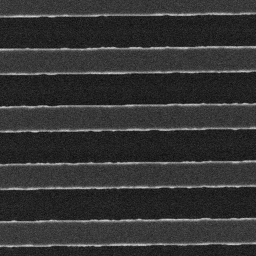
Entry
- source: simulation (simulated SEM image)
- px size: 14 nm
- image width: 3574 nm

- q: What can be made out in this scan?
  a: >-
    lines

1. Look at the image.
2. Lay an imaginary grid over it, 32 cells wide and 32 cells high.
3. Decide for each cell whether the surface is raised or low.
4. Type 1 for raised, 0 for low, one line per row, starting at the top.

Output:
11111111111111111111111111111111
11111111111111111111111111111111
00000000000000000000000000000000
00000000000000000000000000000000
00000000000000000000000000000000
00000000000000000000000000000000
11111111111111111111111111111111
11111111111111111111111111111111
11111111111111111111111111111111
00000000000000000000000000000000
00000000000000000000000000000000
00000000000000000000000000000000
00000000000000000000000000000000
11111111111111111111111111111111
11111111111111111111111111111111
11111111111111111111111111111111
00000000000000000000000000000000
00000000000000000000000000000000
00000000000000000000000000000000
00000000000000000000000000000000
00011111111111111111111111111111
11111111111111111111111111111111
11111111111111111111111111111111
11111111111110100000000000000000
00000000000000000000000000000000
00000000000000000000000000000000
00000000000000000000000000000000
00000000000000000100111111111111
11111111111111111111111111111111
11111111111111111111111111111111
11111111111111111111111111001100
00000000000000000000000000000000